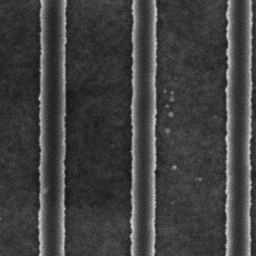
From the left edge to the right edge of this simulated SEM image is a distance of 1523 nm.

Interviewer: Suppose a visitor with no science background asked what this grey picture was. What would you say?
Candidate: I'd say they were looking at lines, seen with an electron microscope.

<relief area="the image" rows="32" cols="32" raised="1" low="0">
00000111000000000110000000000110
00000111000000000111000000001110
00000111000000000111000000000110
00000111000000000110000000001110
00000111000000000111000000001110
00000111000000000111000000000110
00000111000000000111000000001110
00000111000000000111000000000110
00000111000000000111000000000110
00000111000000000110000000001110
00000111000000000110000000001110
00000111000000000110000000001110
00000111000000000110000000001110
00000111000000001111000000001110
00000111000000001110000000001110
00000111000000000110000000001110
00000111000000000110000000001110
00000111000000000110000000001110
00000111000000001110000000001110
00000111000000000110000000001110
00000111000000000110000000001110
00000111000000001110000000001110
00000111000000000110000000001110
00000111000000001110000000001110
00000111000000001110000000001110
00000111000000001110000000001110
00000111000000000110000000001110
00000111000000001110000000001110
00000111000000001110000000001110
00000111000000001110000000001110
00000111000000001110000000001110
00000111000000001110000000001110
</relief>